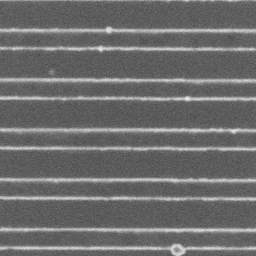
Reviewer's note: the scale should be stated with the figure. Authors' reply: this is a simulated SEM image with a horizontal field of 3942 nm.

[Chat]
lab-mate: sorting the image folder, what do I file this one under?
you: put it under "lines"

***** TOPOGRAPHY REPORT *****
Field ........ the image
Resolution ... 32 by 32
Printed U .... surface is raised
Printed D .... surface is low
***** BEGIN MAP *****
DDDDDDDDDDDDDDDDDDDDDDDDDDDDDDDD
DDDDDDDDDDDDDDDDDDDDDDDDDDDDDDDD
DDDDDDDDDDDDDDDDDDDDDDDDDDDDDDDD
DDDDDDDDDDDDDDDDDDDDDDDDDDDDDDDD
UUUUUUUUUUUUUUUUUUUUUUUUUUUUUUUU
UUUUUUUUUUUUUUUUUUUUUUUUUUUUUUUU
DDDDDDDDDDDDDDDDDDDDDDDDDDDDDDDD
DDDDDDDDDDDDDDDDDDDDDDDDDDDDDDDD
DDDDDDDDDDDDDDDDDDDDDDDDDDDDDDDD
DDDDDDDDDDDDDDDDDDDDDDDDDDDDDDDD
UUUUUUUUUUUUUUUUUUUUUUUUUUUUUUUU
UUUUUUUUUUUUUUUUUUUUUUUUUUUUUUUU
DDDDDDDDDDDDDDDDDDDDDDDDDDDDDDDD
DDDDDDDDDDDDDDDDDDDDDDDDDDDDDDDD
DDDDDDDDDDDDDDDDDDDDDDDDDDDDDDDD
DDDDDDDDDDDDDDDDDDDDDDDDDDDDDDDD
UUUUUUUUUUUUUUUUUUUUUUUUUUUUUUUU
UUUUUUUUUUUUUUUUUUUUUUUUUUUUUUUU
UUUUUUUUUUUUUUUUUUUUUUUUUUUUUUUU
DDDDDDDDDDDDDDDDDDDDDDDDDDDDDDDD
DDDDDDDDDDDDDDDDDDDDDDDDDDDDDDDD
DDDDDDDDDDDDDDDDDDDDDDDDDDDDDDDD
UUUDUUUUUUUUDDDDUUUDDDDDDDDDDDDD
UUUUUUUUUUUUUUUUUUUUUUUUUUUUUUUU
UUUUUUUUUUUUUUUUUUUUUUUUUUUUUUUU
DDDDDDDDDDDDDDDDDDDDDDDDDDDDDDDD
DDDDDDDDDDDDDDDDDDDDDDDDDDDDDDDD
DDDDDDDDDDDDDDDDDDDDDDDDDDDDDDDD
DDDDDDDDDDDDDDDDDDDDDDDDDDDDDDDD
UUUUUUUUUUUUUUUUUUUUUUUUUUUUUUUU
UUUUUUUUUUUUUUUUUUUUUUUUUUUUUUUU
DDDDDDDDDDDDDDDDDDDDDDUDDDDDDDDD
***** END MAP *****